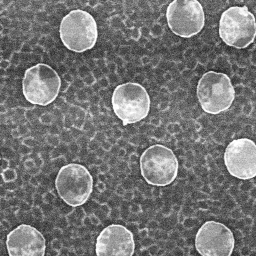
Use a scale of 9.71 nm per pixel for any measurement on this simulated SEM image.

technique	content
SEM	raised bodies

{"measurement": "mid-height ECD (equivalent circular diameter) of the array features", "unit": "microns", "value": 0.371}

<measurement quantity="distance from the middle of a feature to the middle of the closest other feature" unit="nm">666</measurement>